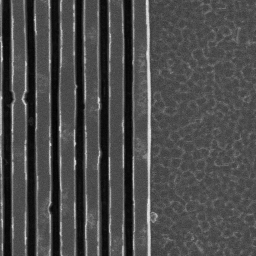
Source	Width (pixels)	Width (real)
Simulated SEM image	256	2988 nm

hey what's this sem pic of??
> parallel lines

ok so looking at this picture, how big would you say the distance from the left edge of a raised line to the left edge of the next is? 284 nanometres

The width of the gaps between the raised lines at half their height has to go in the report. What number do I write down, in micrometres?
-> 0.104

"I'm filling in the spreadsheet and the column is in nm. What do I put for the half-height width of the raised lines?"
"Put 185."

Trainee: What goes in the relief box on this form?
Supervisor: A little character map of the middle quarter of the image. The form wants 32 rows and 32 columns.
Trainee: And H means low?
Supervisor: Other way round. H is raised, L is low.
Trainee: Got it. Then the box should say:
HHHLLHHHHLLHHHHLLHHHHLLLLLLLLLLL
HHHLLHHHHLLHHHHLLHHHHLLLLLLLLLLL
HHHLLHHHHLLHHHHLLHHHHLLLLLLLLLLL
HHHLLHHHHLLHHHHLLHHHHLLLLLLLLLLL
HHHLLHHHHLLHHHHLLHHHHLLLLLLLLLLL
HHHLLHHHHLLHHHHLLHHHHLLLLLLLLLLL
HHHLLHHHHLLHHHHLLHHHHLLLLLLLLLLL
HHHLLHHHHLLHHHHLLHHHHLLLLLLLLLLL
HHHLLHHHHLLHHHHLLHHHHLLLLLLLLLLL
HHHLLHHHHLLHHHHLLHHHHLLLLLLLLLLL
HHHLLHHHHLLHHHHLLHHHHLLLLLLLLLLL
HHHLLHHHHLLHHHHLLHHHHLLLLLLLLLLL
HHHLLHHHHLLHHHHLLHHHHLLLLLLLLLLL
HHHLLHHHHLLHHHHLLHHHHLLLLLLLLLLL
HHHLLHHHHLLHHHHLLHHHHLLLLLLLLLLL
HHHLLHHHHLLHHHHLLHHHHLLLLLLLLLLL
HHHLLHHHHLLHHHHLLHHHHLLLLLLLLLLL
HHHLLHHHHLLHHHHLLHHHHLLLLLLLLLLL
HHHLLHHHHLLHHHHLLHHHHLLLLLLLLLLL
HHHLLHHHHLLHHHHLLHHHHLLLLLLLLLLL
HHHLLHHHHLLHHHHLLHHHHLLLLLLLLLLL
HHHLLHHHHLLHHHHLLHHHHLLLLLLLLLLL
HHHLLHHHHLLHHHHLLHHHHLLLLLLLLLLL
HHHLLHHHHLLHHHHLLHHHHLLLLLLLLLLL
HHHLLHHHHLLHHHHLLHHHHLLLLLLLLLLL
HHHLLHHHHLLHHHHLLHHHHLLLLLLLLLLL
HHHLLHHHHLLHHHHLLHHHHLLLLLLLLLLL
HHHLLHHHHLLHHHHLLHHHHLLLLLLLLLLL
HHHLLHHHHLLHHHHLLHHHHLLLLLLLLLLL
HHHLLHHHHLLHHHHLLHHHHLLLLLLLLLLL
HHHLLHHHHLLHHHHLLHHHHLLLLLLLLLLL
HHHLLHHHHLLHHHHLLHHHHLLLLLLLLLLL